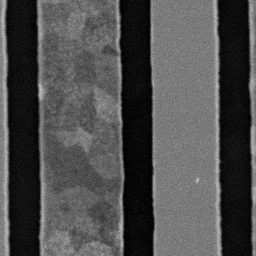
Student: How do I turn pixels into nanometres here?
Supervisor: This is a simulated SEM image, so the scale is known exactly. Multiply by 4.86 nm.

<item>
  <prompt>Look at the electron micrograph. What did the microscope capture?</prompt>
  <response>lines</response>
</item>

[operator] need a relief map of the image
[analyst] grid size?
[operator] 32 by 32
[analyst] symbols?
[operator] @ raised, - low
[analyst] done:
@----@@@@@@@@@@----@@@@@@@@----@
@----@@@@@@@@@@----@@@@@@@@----@
@----@@@@@@@@@@----@@@@@@@@----@
@----@@@@@@@@@@----@@@@@@@@----@
@----@@@@@@@@@@----@@@@@@@@----@
@----@@@@@@@@@@----@@@@@@@@----@
@----@@@@@@@@@@----@@@@@@@@----@
@----@@@@@@@@@@----@@@@@@@@----@
@----@@@@@@@@@@----@@@@@@@@----@
@----@@@@@@@@@@----@@@@@@@@----@
@----@@@@@@@@@@----@@@@@@@@----@
@----@@@@@@@@@@----@@@@@@@@----@
@----@@@@@@@@@@----@@@@@@@@----@
@----@@@@@@@@@@----@@@@@@@@----@
@----@@@@@@@@@@----@@@@@@@@-----
@----@@@@@@@@@@----@@@@@@@@-----
@----@@@@@@@@@@----@@@@@@@@----@
@----@@@@@@@@@@----@@@@@@@@----@
@----@@@@@@@@@@----@@@@@@@@----@
@----@@@@@@@@@@----@@@@@@@@-----
@----@@@@@@@@@@----@@@@@@@@-----
@----@@@@@@@@@@----@@@@@@@@-----
@----@@@@@@@@@@----@@@@@@@@-----
@----@@@@@@@@@@----@@@@@@@@-----
@----@@@@@@@@@@----@@@@@@@@-----
@----@@@@@@@@@@----@@@@@@@@-----
@----@@@@@@@@@@----@@@@@@@@-----
@----@@@@@@@@@@----@@@@@@@@-----
@----@@@@@@@@@@----@@@@@@@@-----
@----@@@@@@@@@@----@@@@@@@@-----
@----@@@@@@@@@@----@@@@@@@@@----
@----@@@@@@@@@@----@@@@@@@@@----